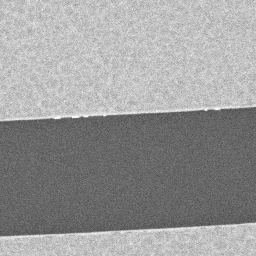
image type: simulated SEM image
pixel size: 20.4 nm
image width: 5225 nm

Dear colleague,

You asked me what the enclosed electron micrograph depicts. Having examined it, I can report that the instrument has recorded one or a few lines or trenches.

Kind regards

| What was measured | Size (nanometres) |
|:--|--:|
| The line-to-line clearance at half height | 2390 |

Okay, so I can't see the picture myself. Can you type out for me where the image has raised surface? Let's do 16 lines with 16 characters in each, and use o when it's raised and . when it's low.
oooooooooooooooo
oooooooooooooooo
oooooooooooooooo
oooooooooooooooo
oooooooooooooooo
oooooooooooooooo
oooooooooooooooo
................
................
................
................
................
................
................
.......ooooooooo
oooooooooooooooo